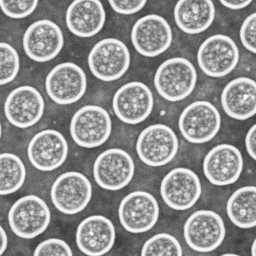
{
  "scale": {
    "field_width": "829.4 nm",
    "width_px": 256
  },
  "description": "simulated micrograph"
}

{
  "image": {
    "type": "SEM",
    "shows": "a regular array of raised bodies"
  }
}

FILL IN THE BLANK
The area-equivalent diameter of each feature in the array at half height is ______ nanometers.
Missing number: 123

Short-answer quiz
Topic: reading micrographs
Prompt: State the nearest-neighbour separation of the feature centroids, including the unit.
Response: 157 nm